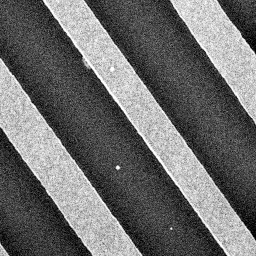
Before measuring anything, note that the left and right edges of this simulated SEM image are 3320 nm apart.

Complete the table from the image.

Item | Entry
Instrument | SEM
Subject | lines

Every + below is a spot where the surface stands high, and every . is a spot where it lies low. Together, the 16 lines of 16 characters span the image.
...+++.....+++..
....++......+++.
....+++.....+++.
.....+++.....+++
+.....++......++
+......++.....++
++.....+++.....+
+++.....+++.....
+++......++.....
.+++......++....
..+++.....+++...
...+++.....++...
...+++......++..
....+++.....+++.
.....+++.....+++
.....++++.....++